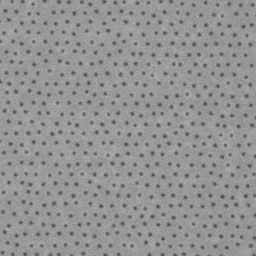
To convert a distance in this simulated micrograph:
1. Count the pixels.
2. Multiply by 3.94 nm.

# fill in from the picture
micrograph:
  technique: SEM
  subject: a regular array of holes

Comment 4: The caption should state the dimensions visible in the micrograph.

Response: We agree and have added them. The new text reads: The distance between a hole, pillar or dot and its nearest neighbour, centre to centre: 38.5 nm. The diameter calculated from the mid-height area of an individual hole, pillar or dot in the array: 15.4 nm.